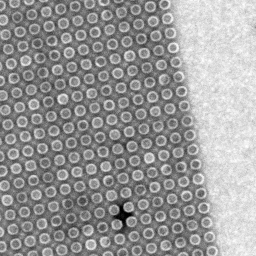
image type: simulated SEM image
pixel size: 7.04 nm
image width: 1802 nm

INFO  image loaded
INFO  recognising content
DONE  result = a regular array of raised bodies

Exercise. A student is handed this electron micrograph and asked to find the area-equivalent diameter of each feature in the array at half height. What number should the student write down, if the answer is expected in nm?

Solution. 70.1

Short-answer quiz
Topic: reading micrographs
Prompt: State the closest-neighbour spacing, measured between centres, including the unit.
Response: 103 nm